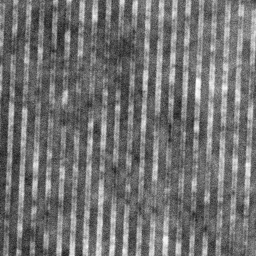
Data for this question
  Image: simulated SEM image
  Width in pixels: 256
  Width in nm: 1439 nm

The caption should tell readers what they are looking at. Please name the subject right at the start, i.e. parallel lines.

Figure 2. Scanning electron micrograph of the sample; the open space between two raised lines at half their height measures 49.1 nanometers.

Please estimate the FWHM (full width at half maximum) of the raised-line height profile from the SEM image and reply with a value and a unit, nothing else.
26 nm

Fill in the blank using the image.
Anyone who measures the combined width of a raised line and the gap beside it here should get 74.6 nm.